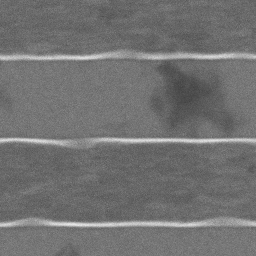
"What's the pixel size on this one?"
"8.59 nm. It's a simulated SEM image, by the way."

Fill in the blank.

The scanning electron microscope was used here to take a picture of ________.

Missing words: wiring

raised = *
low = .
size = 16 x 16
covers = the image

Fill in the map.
****************
****************
****************
*******..*******
................
................
................
................
................
****************
****************
****************
****************
****************
................
................